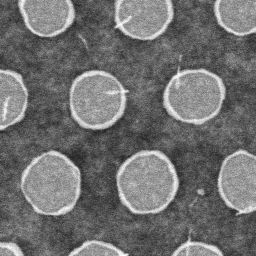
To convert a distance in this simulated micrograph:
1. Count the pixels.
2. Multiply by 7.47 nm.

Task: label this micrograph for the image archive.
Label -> raised bodies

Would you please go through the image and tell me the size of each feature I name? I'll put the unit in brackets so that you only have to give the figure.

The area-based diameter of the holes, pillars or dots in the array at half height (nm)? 430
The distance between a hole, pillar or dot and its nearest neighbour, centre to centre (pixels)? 95.7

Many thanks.